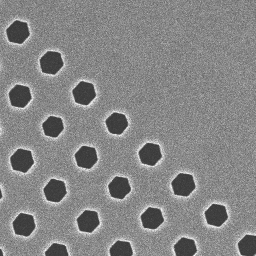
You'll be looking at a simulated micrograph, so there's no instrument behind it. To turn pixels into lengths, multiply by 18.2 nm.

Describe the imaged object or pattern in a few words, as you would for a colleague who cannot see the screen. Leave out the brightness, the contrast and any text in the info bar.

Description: a regular array of holes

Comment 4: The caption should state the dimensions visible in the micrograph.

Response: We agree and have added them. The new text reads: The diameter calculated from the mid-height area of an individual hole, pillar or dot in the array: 411 nm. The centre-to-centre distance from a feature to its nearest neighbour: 818 nm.